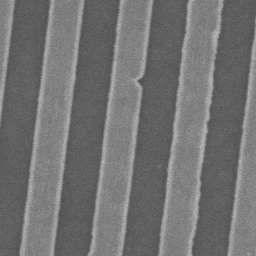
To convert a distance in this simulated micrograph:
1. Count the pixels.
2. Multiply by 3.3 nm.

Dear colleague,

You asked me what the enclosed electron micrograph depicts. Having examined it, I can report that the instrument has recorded one or a few lines or trenches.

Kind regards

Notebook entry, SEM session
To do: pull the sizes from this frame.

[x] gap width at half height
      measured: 128 nanometers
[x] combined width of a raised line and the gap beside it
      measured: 68.7 px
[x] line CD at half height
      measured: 99.5 nanometers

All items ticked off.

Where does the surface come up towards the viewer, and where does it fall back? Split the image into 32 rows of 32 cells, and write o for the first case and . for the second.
oo....oooo.....oooo.....oooo....
o.....oooo.....oooo.....ooo.....
o.....oooo.....oooo.....ooo.....
o.....oooo.....ooo.....oooo.....
o.....oooo.....ooo.....oooo.....
o.....oooo.....ooo.....oooo.....
o.....oooo....oooo.....oooo.....
o.....ooo.....oooo.....oooo.....
o.....ooo.....oooo.....oooo....o
o....oooo.....oooo.....ooo.....o
.....oooo.....ooo......ooo.....o
.....oooo.....oooo....oooo.....o
.....oooo.....ooo.....oooo.....o
.....oooo.....ooo.....oooo.....o
.....oooo....oooo.....oooo.....o
.....oooo....oooo.....oooo.....o
....oooo.....oooo.....oooo....oo
....oooo.....oooo.....ooo.....oo
....oooo.....oooo.....ooo.....oo
....oooo.....oooo....oooo.....oo
....oooo.....ooo.....oooo.....oo
....oooo.....ooo.....oooo.....oo
....oooo.....ooo.....oooo.....oo
....ooo.....oooo.....oooo.....oo
....ooo.....oooo.....oooo.....oo
...oooo.....oooo.....oooo....ooo
...oooo.....oooo.....ooo.....ooo
...oooo.....oooo....oooo.....ooo
...oooo.....oooo....oooo.....ooo
...oooo.....ooo.....oooo.....ooo
...oooo.....ooo.....oooo.....ooo
...oooo....oooo.....oooo.....ooo